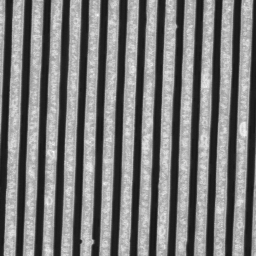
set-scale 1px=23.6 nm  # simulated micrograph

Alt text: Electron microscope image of parallel lines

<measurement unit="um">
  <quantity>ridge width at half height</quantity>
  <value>0.285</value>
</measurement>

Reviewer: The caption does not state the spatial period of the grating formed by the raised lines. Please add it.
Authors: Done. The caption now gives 19 px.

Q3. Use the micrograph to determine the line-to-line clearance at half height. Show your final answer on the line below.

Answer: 156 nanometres